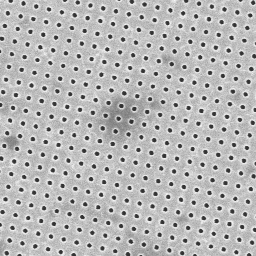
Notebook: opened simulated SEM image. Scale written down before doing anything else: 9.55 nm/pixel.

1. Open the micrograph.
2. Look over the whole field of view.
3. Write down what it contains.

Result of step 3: a regular array of holes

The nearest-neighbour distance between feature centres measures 123 nanometres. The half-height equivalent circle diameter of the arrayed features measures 44.4 nm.